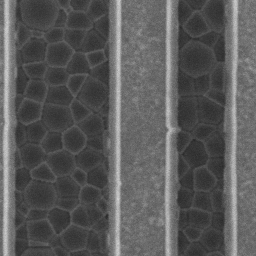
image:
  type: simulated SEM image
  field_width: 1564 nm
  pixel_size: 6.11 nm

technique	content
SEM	one or a few lines or trenches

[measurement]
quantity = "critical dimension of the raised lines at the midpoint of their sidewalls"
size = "305 nanometres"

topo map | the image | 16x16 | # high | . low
.......####....#
.......####....#
.......####....#
.......####....#
.......####....#
.......###.....#
.......####....#
.......####....#
.......####....#
.......####....#
.......###.....#
.......###.....#
.......###.....#
.......###.....#
.......###.....#
.......###.....#